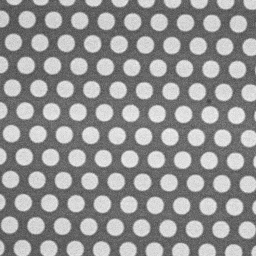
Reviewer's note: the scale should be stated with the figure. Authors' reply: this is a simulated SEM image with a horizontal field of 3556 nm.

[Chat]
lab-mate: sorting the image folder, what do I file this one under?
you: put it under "an array of small figures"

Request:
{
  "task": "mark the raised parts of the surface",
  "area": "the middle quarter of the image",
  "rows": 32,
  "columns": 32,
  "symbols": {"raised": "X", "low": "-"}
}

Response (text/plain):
--XXXX--XXXX---XXXX---XXX---XXXX
--XXX---XXXX---XXXX---XXX---XXXX
---X-----XX-----XX----XXX----XXX
--------------------------------
X-------------------------------
XX---XXXX---XXX---XXXX---XXX----
XX---XXXX---XXX---XXXX---XXXX--X
XX---XXXX---XXX---XXXX---XXXX--X
-------------------XX-----XX----
--------------------------------
--XXX----XX-----X---------------
-XXXX---XXXX---XXX----XXX---XXXX
-XXXX---XXXX---XXXX--XXXX---XXXX
--XXX---XXXX---XXX----XXX---XXXX
-----------------------------X--
--------------------------------
XX---XXX----XXX----XX----XX-----
XX---XXXX--XXXX---XXXX---XXX---X
XX---XXXX--XXXX---XXXX--XXXXX--X
X----XXX----XXX---XXX----XXX---X
--------------------------------
--------------------------------
--XXX---XXX----XXX----XX----XXX-
-XXXX---XXXX---XXX---XXXX---XXXX
-XXXX---XXXX---XXX---XXXX---XXXX
---------XX----XX-----XX----XXX-
--------------------------------
X----XX-----XX------------------
XX---XXX---XXXX---XXX----XXX---X
XX---XXX---XXXX---XXXX--XXXX---X
X----XXX---XXXX---XXX---XXXX---X
-------------------X-----XX-----